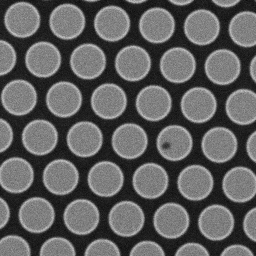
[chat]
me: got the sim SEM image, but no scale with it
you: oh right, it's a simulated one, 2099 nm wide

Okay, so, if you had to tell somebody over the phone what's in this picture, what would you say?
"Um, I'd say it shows an array of small figures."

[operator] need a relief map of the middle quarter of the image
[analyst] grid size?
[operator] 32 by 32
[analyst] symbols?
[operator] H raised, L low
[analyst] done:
LLHHHHHHHHLLLHHHHHHHHLLLHHHHHHHH
LLHHHHHHHHLLLHHHHHHHHLLLHHHHHHHH
LLLHHHHHHLLLLLHHHHHHHLLLLHHHHHHH
LLLLLHHLLLLLLLLHHHHHLLLLLLHHHHHL
LLLLLLLLLLLLLLLLLLLLLLLLLLLLLHLL
HHHLLLLLLHHHHLLLLLLLLLLLLLLLLLLL
HHHHLLLLHHHHHHHLLLLLHHHHHLLLLLLL
HHHHLLLHHHHHHHHLLLLHHHHHHHLLLLHH
HHHHLLLHHHHHHHHLLLHHHHHHHHLLLLHH
HHHHLLLHHHHHHHHLLLHHHHHHHHHLLLHH
HHHHLLLHHHHHHHHLLLHHHHHHHHHLLHHH
HHHLLLLHHHHHHHHLLLLHHHHHHHLLLHHH
HHLLLLLLHHHHHHLLLLLHHHHHHHLLLLHH
LLLLLLLLLLHHLLLLLLLLHHHHHLLLLLLH
LLLLLLLLLLLLLLLLLLLLLLLLLLLLLLLL
LLHHHHHHLLLLLLHHHHHLLLLLLLLLLLLL
LLHHHHHHHLLLLHHHHHHHLLLLLHHHHHHL
LHHHHHHHHLLLLHHHHHHHLLLLHHHHHHHL
LHHHHHHHHLLLHHHHHHHHHLLHHHHHHHHH
LHHHHHHHHLLLHHHHHHHHHLLHHHHHHHHH
LHHHHHHHHLLLHHHHHHHHHLLHHHHHHHHH
LLHHHHHHHLLLLHHHHHHHLLLLHHHHHHHH
LLLHHHHHLLLLLHHHHHHLLLLLHHHHHHHL
LLLLLLLLLLLLLLLHHLLLLLLLLHHHHHLL
HLLLLLLLLLHLLLLLLLLLLLLLLLLLLLLL
HHLLLLLLHHHHHLLLLLLLHHHHLLLLLLLL
HHHLLLLHHHHHHHLLLLHHHHHHHLLLLLHH
HHHLLLHHHHHHHHLLLLHHHHHHHHLLLHHH
HHHLLLHHHHHHHHHLLHHHHHHHHHLLLHHH
HHHLLLHHHHHHHHHLLHHHHHHHHHLLLHHH
HHHLLLLHHHHHHHLLLLHHHHHHHHLLLHHH
HHLLLLLHHHHHHHLLLLHHHHHHHLLLLHHH